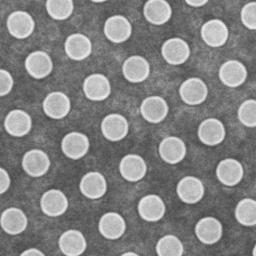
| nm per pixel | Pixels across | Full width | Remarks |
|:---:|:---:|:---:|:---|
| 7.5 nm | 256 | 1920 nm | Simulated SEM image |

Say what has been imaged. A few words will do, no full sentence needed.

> a regular array of raised bodies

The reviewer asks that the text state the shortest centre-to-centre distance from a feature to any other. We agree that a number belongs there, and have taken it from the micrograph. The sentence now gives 323 nanometers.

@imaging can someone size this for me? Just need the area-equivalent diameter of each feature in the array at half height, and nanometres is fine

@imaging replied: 193